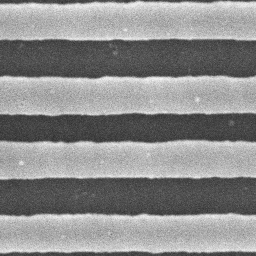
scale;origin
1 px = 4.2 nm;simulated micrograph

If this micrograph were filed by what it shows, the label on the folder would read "lines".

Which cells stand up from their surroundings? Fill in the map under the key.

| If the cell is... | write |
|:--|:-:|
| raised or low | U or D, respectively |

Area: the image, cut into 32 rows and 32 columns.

DDDUUDDDDUDUUUUUUUUUUUUUUUUUUUUU
UUUUUUUUUUUUUUUUUUUUUUUUUUUUUUUU
UUUUUUUUUUUUUUUUUUUUUUUUUUUUUUUU
UUUUUUUUUUUUUUUUUUUUUUUUUUUUUUUU
UUUUUUUUUUUUUUUUUUUUUUUUUUUUUUUU
DDDDDDDDDDDDDDDDDDDDDDDDDDDDDDDD
DDDDDDDDDDDDDDDDDDDDDDDDDDDDDDDD
DDDDDDDDDDDDDDDDDDDDDDDDDDDDDDDD
DDDDDDDDDDDDDDDDDDDDDDDDDDDDDDDD
DDDDDDDDDDDDDDDDDDDDDDDDDDDDDDDD
UUUUUUUUUUUUUUUUUUUUUUUUUUUUUUUU
UUUUUUUUUUUUUUUUUUUUUUUUUUUUUUUU
UUUUUUUUUUUUUUUUUUUUUUUUUUUUUUUU
UUUUUUUUUUUUUUUUUUUUUUUUUUUUUUUU
DDDDDDDDDDDDDDDDDDDDDDDDDDDDDDDD
DDDDDDDDDDDDDDDDDDDDDDDDDDDDDDDD
DDDDDDDDDDDDDDDDDDDDDDDDDDDDDDDD
DDDDDDDDDDDDDDDDDDDDDDDDDDDDDDDD
UUUUUUUUUUUUUUUUUUUUUUUUUUUUUUUU
UUUUUUUUUUUUUUUUUUUUUUUUUUUUUUUU
UUUUUUUUUUUUUUUUUUUUUUUUUUUUUUUU
UUUUUUUUUUUUUUUUUUUUUUUUUUUUUUUU
DDDDDDDDDDDDDDDDDDDDDDDDDDDDDDDD
DDDDDDDDDDDDDDDDDDDDDDDDDDDDDDDD
DDDDDDDDDDDDDDDDDDDDDDDDDDDDDDDD
DDDDDDDDDDDDDDDDDDDDDDDDDDDDDDDD
DDDDDDDDDDDDDDDDDDDDDDDDDDDDDDDD
UUUUUUUUUUUUUUUUUUUUUUUUUUUUUUUU
UUUUUUUUUUUUUUUUUUUUUUUUUUUUUUUU
UUUUUUUUUUUUUUUUUUUUUUUUUUUUUUUU
UUUUUUUUUUUUUUUUUUUUUUUUUUUUUUUU
UUUUDUDUUDDUUUDDDDUUUDDUUUUDDDDD